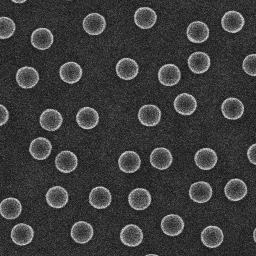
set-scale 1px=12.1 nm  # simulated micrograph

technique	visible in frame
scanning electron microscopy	a regular array of raised bodies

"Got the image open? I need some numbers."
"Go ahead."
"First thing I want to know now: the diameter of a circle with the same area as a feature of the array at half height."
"257 nm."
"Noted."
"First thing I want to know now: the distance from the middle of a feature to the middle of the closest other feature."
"449 nm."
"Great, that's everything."